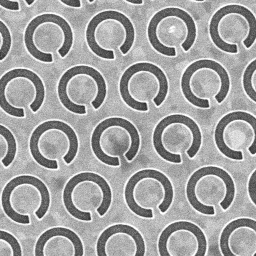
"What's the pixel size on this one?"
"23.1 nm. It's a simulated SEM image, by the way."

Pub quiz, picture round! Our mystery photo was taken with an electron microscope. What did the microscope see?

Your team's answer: an array of small figures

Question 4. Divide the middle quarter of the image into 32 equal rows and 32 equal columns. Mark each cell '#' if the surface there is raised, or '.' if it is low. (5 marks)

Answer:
###...##########.......########.
#.......#######..........#####..
.........######...####...#####..
..#####...####...######...###...
.#######..####..########..###...
.#######...###..########..###...
.#######...###..########..###...
.#######...###...######...####..
.#######..####...#####....####..
..#####...#####.....##...######.
.....##..#######.....##.########
#.....############...###########
###..######################..###
###########...###########.......
#########.......########........
..######..........#####...#####.
..#####...#####...#####..#######
...####...######...###...#######
#..####..#######...###..########
#...###..########..###...#######
#...###..########..###...#######
#..####...######...####...#####.
...####....####...######.....##.
...#####......##.#######.....###
..#######.....############...###
###########..###################
###################....#########
###......########........#######
##........######..........#####.
#....##....#####...#####...####.
...######..####...#######..####.
..#######...###...#######..###..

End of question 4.